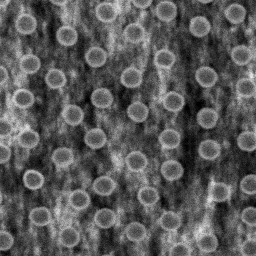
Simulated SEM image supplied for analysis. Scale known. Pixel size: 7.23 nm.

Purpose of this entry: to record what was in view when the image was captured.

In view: a regular array of raised bodies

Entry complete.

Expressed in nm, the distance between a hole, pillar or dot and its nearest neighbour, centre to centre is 254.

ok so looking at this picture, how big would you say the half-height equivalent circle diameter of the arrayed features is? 149 nm